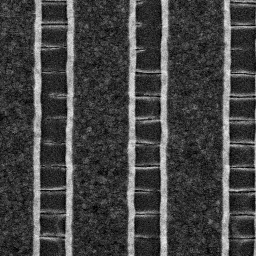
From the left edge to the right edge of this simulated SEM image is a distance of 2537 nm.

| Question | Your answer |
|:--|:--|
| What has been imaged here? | wiring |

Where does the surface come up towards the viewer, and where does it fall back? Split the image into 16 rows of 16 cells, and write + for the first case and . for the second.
++..++++..++++..
++..++++..++++..
++..++++..++++..
++..++++..++++..
++..++++..++++..
++..++++..++++..
++..++++..++++..
++..++++..++++..
++..++++..++++..
++..++++..++++..
++..++++..++++..
++..++++..++++..
++..++++..++++..
++..++++..++++..
++..++++..++++..
++..++++..++++..